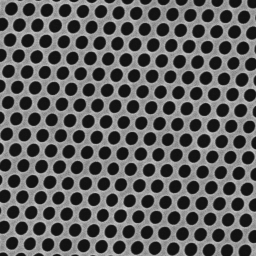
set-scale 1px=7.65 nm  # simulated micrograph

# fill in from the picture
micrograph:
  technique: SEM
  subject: a regular array of holes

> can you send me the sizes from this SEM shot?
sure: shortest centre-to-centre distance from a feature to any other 134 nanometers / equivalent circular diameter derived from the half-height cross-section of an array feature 97.3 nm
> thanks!